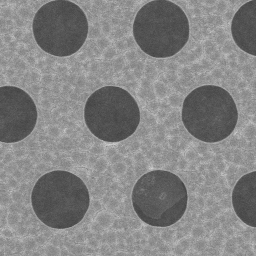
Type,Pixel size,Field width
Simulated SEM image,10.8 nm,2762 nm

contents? holes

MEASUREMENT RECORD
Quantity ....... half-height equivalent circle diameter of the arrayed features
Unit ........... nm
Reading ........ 611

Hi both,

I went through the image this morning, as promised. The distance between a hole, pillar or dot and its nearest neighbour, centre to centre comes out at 1050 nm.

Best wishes